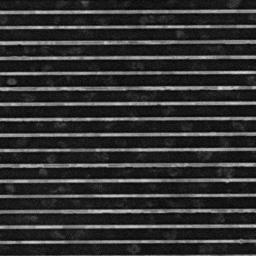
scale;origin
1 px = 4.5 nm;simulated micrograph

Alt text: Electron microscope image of parallel lines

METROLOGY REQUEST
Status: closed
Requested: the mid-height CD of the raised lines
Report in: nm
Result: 12.9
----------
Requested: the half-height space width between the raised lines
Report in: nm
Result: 55.2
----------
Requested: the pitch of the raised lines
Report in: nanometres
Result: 69